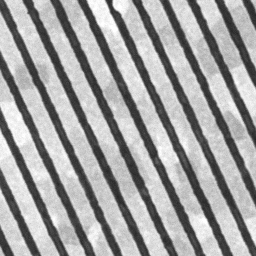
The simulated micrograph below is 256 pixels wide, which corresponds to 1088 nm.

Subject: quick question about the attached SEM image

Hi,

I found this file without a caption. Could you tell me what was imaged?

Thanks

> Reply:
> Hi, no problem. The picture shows parallel lines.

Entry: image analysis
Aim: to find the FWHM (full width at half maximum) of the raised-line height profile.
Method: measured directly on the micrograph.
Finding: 0.065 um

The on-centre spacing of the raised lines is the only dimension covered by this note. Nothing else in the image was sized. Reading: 106 nm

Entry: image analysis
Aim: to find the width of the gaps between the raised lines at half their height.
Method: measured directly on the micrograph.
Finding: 0.0385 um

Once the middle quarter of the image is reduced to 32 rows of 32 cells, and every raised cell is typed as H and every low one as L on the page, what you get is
HHHHLLLHHHHLLHHHHHLLHHHHHLLHHHHL
HHHHLLLHHHHLLLHHHHLLLHHHHLLLHHHH
LHHHHLLHHHHHLLHHHHHLLHHHHLLLHHHH
LHHHHLLLHHHHLLLHHHHLLLHHHHLLLHHH
LLHHHHLLLHHHHLLHHHHHLLHHHHLLLHHH
LLHHHHLLLHHHHLLLHHHHLLLHHHHLLLHH
LLLHHHHLLHHHHHLLHHHHHLLHHHHLLLHH
LLLHHHHLLLHHHHLLLHHHHLLLHHHHLLLH
HLLLHHHHLLHHHHHLLHHHHLLLHHHHLLLH
HLLLHHHHLLLHHHHLLLHHHHLLLHHHHLLH
HHLLHHHHLLLHHHHLLLHHHHLLLHHHHLLL
HHLLLHHHHLLLHHHHLLLHHHHLLHHHHLLL
HHHLLHHHHLLLHHHHLLLHHHHLLLHHHHLL
HHHLLLHHHHLLLHHHHLLLHHHHLLHHHHLL
HHHHLLHHHHHLLHHHHLLLHHHHLLLHHHHL
HHHHLLLHHHHLLLHHHHLLLHHHHLLHHHHH
HHHHHLLHHHHLLLHHHHLLLHHHHLLLHHHH
LHHHHLLLHHHHLLLHHHHLLHHHHHLLHHHH
LHHHHLLLHHHHLLLHHHHLLLHHHHLLLHHH
LLHHHHLLLHHHHLLHHHHHLLHHHHLLLHHH
LLHHHHLLLHHHHLLLHHHHLLLHHHHLLLHH
LLLHHHHLLHHHHHLLHHHHHLLHHHHLLLHH
LLLHHHHLLLHHHHLLLHHHHLLLHHHHLLLH
HLLLHHHHLLHHHHHLLHHHHLLLHHHHLLLH
HLLLHHHHLLLHHHHLLLHHHHLLLHHHHLLL
HHLLLHHHHLLHHHHHLLHHHHLLLHHHHLLL
HHLLLHHHHLLLHHHHLLLHHHHLLLHHHHLL
HHHLLLHHHHLLHHHHLLLHHHHLLLHHHHLL
HHHLLLHHHHLLLHHHHLLLHHHHLLHHHHHL
HHHHLLLHHHLLLHHHHLLLHHHHLLLHHHHL
HHHHLLLHHHHLLLHHHHLLLHHHHLLHHHHH
HHHHHLLHHHHHLLHHHHLLLHHHHLLLHHHH